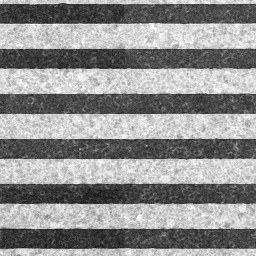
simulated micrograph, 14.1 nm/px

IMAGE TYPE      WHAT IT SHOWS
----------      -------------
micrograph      parallel lines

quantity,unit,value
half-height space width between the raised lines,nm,287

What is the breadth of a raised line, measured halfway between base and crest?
343 nm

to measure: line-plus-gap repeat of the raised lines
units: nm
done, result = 632